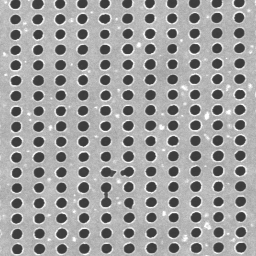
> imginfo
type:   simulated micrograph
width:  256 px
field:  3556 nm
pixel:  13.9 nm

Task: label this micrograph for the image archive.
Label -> a regular array of holes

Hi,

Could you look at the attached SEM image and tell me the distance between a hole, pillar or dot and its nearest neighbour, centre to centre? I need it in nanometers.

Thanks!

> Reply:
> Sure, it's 211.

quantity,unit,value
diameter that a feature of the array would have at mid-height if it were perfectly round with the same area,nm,145